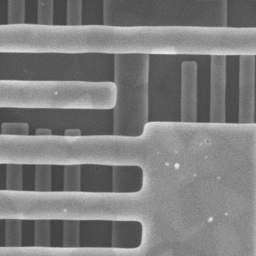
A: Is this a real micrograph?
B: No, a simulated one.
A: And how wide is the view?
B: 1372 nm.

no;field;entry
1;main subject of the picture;wiring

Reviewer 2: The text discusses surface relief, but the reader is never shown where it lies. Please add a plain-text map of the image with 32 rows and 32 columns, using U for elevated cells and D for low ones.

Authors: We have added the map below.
DDDDDDDDDDDDDDDDDDDDDDDDDDDDDDDD
DDDDDDDDDDDDDDDDDDDDDDDDDDDDDDDD
DDDDDDDDDDDDDDDDDDDDDDDDDDDDDDDD
UUUUUUUUUUUUUUUUUUUUUUUUUUUUUUUU
UUUUUUUUUUUUUUUUUUUUUUUUUUUUUUUU
UUUUUUUUUUUUUUUUUUUUUUUUUUUUUUUU
UUUUUUUUUUUUUUUUUUUUUUUUUUUUUUUU
DDDDDDDDDDDDDDDDDDDDDDDDDDDDDDDD
DDDDDDDDDDDDDDDDDDDDDDDDDDDDDDDD
DDDDDDDDDDDDDDDDDDDDDDDDDDDDDDDD
UUUUUUUUUUUUUUDDDDDDDDDDDDDDDDDD
UUUUUUUUUUUUUUUDDDDDDDDDDDDDDDDD
UUUUUUUUUUUUUUDDDDDDDDDDDDDDDDDD
DDDDDDDDDDUUUUDDDDDDDDDDDDDDDDDD
DDDDDDDDDDDDDDDDDDDDDDDDDDDDDDDD
DDDDDDDDDDDDDDDDDDUUUUUUUUUUDDDD
DDDDDDDDDDDDDDDDDDUUUUUUUUUUUUUU
UUUUUUUUUUUUUUUUUUUUUUUUUUUUUUUU
UUUUUUUUUUUUUUUUUUUUUUUUUUUUUUUU
UUUUUUUUUUUUUUUUUUUUUUUUUUUUUUUU
DDDDDDDUUDDDUUUUUUUUUUUUUUUUUUUU
DDDDDDDDDDDDDDDDDDUUUUUUUUUUUUUU
DDDDDDDDDDDDDDDDDDUUUUUUUUUUUUUU
DDDDDDDDDDDDDDDDDDUUUUUUUUUUUUUU
UUUUUUUUUUUUUUUUUUUUUUUUUUUUUUUU
UUUUUUUUUUUUUUUUUUUUUUUUUUUUUUUU
UUUUUUUUUUUUUUUUUUUUUUUUUUUUUUUU
DDDDDDDDDDDDDUUUUUUUUUUUUUUUUUUU
DDDDDDDDDDDDDDDDDDUUUUUUUUUUUUUU
DDDDDDDDDDDDDDDDDDUUUUUUUUUUUUUU
DDDDDDDDDDDDDDDDDDUUUUUUUUUUUUUU
UUUUUUUUUUUUUUUUUUUUUUUUUUUUUUUU